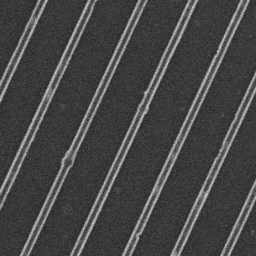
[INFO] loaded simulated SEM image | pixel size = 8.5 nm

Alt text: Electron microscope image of parallel lines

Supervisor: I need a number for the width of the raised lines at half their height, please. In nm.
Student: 61.7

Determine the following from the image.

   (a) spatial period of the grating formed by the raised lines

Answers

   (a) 0.388 micrometres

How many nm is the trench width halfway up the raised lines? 323